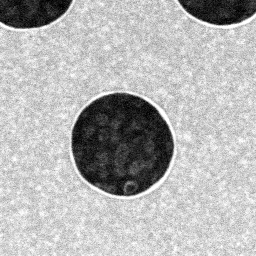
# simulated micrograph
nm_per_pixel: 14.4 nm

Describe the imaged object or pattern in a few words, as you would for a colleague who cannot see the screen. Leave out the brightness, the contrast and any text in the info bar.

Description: holes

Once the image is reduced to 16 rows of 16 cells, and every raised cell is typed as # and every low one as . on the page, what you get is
....#######.....
...##########..#
################
################
################
################
######....######
#####.....######
####.......#####
#####......#####
#####......#####
######....######
################
################
################
################